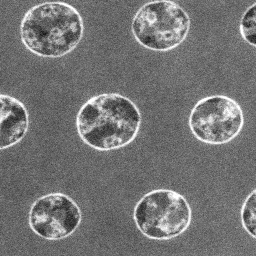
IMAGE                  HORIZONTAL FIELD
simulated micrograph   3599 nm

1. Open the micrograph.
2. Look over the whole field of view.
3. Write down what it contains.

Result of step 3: raised bodies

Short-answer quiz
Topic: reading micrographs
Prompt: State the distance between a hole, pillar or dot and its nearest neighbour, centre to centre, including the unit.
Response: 1.52 um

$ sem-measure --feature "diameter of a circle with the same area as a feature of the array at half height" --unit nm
724